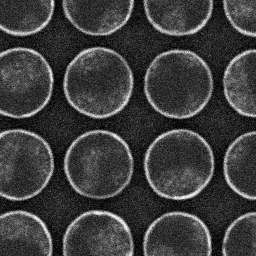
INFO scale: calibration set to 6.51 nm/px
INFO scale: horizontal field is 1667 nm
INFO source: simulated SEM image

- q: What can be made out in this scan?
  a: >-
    raised bodies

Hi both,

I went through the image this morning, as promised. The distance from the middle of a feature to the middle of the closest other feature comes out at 522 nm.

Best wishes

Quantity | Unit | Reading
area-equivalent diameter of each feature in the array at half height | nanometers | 443